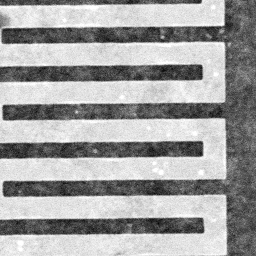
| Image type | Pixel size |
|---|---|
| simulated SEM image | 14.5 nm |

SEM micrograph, groups of lines, slits or small figures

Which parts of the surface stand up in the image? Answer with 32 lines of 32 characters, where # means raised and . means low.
.........................###....
############################....
############################....
#...............................
................................
#.........#####..##...######....
############################....
############################....
.........................###....
.........................###....
############################....
############################....
############################....
................................
................................
############################....
############################....
#######################..###....
..........................##....
.........................###....
############################....
############################....
#...............................
................................
#....................##.####....
############################....
############################....
.........................###....
..........................##....
############################....
############################....
############################....